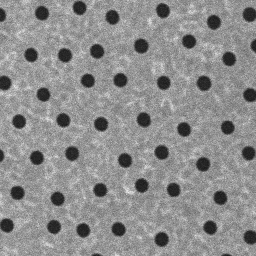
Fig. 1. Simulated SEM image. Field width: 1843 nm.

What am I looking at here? a regular array of holes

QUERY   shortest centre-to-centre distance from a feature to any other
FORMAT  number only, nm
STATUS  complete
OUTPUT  244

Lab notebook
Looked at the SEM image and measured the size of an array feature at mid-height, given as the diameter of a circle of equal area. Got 106 nm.